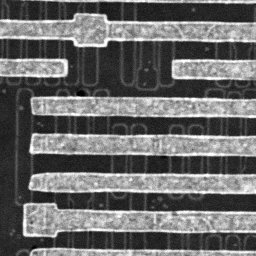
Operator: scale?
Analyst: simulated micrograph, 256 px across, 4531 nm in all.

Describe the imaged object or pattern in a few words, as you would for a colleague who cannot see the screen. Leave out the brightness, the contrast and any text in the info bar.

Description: wiring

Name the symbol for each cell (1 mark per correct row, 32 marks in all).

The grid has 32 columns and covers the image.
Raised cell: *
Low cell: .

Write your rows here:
................................
................................
.........****...................
********************************
********************************
..........***...................
................................
*...............................
********..............**********
.....**...............**********
................................
................................
....*************************.**
....****************************
..............................**
................................
................................
....****************************
....****************************
................................
................................
................................
....****************************
....****************************
................................
................................
...***********..................
...*****************************
...*****************************
................................
................................
....**************************..